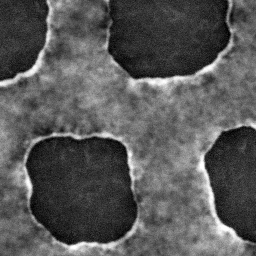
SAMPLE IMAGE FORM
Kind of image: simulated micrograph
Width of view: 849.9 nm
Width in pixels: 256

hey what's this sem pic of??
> holes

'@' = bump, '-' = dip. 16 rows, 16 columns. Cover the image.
---@@@@-------@@
---@@@@-------@@
---@@@@-------@@
---@@@@-------@@
--@@@@@@-----@@@
@@@@@@@@@@@@@@@@
@@@@@@@@@@@@@@@@
@@@@@@@@@@@@@@@@
@@@@---@@@@@@@--
@@------@@@@@---
@@------@@@@@---
@@------@@@@@---
@@------@@@@@---
@@-------@@@@---
@@@-----@@@@@@--
@@@@@@@@@@@@@@@@